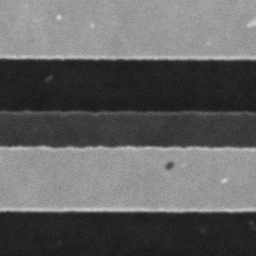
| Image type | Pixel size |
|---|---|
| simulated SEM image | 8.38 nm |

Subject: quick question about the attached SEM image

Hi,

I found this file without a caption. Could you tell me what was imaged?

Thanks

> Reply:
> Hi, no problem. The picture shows lines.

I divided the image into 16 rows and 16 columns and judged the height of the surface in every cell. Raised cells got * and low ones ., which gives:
****************
****************
****************
****************
................
................
................
................
................
****************
****************
****************
****************
................
................
................